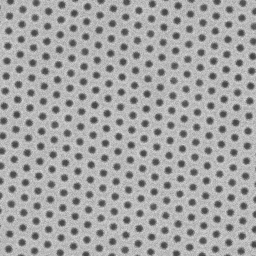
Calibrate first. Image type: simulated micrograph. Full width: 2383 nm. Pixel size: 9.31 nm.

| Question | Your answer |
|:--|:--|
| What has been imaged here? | a regular array of holes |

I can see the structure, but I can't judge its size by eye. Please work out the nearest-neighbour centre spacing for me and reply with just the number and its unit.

137 nm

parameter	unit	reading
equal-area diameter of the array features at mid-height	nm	77.2